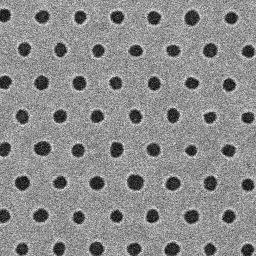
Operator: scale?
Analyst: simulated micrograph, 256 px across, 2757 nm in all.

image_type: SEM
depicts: a regular array of holes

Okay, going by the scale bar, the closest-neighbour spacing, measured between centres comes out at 400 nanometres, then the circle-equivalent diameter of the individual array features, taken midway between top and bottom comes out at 161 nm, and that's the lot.